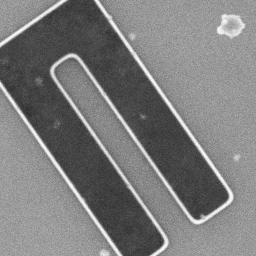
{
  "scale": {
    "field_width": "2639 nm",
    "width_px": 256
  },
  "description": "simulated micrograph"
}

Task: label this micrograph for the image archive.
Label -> groups of lines, slits or small figures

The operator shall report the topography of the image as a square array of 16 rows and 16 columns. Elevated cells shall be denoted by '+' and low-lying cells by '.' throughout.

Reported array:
...+++..........
..+++++.........
++++++++........
++++++++........
+++..++++.......
++++..++++......
.++++..++++.....
..+++...+++.....
..++++..++++....
...++++..++++...
....+++...+++...
....++++..++++..
.....++++..+++..
......+++...+...
......++++......
.......+++......